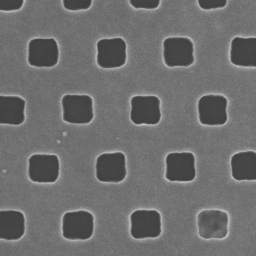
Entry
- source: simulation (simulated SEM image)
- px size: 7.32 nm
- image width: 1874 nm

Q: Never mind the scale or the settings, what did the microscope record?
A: a regular array of holes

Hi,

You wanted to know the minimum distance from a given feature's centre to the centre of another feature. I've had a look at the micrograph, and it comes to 486 nanometers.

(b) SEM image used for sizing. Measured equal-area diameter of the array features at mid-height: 228 nm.